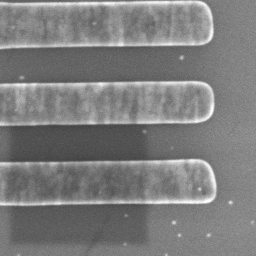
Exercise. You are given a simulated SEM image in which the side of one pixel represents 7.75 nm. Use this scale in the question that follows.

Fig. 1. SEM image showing wiring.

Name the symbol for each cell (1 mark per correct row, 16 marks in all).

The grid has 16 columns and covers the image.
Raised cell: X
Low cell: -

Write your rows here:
XXXXXXXXXXXXX---
XXXXXXXXXXXXX---
XXXXXXXXXXXXX---
----------------
----------------
XXXXXXXXXXXXX---
XXXXXXXXXXXXX---
XXXXXXXXXXXXX---
----------------
----------------
XXXXXXXXXXXXX---
XXXXXXXXXXXXX---
XXXXXXXXXXXXX---
----------------
----------------
----------------